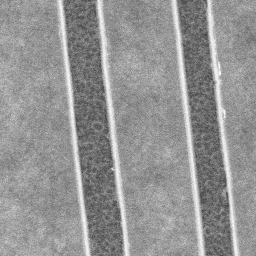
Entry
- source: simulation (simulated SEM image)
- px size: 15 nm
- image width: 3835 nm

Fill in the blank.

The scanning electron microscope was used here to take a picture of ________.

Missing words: one or a few lines or trenches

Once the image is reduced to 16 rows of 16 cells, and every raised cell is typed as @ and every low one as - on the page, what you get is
@@@@--@@@@@--@@@
@@@@--@@@@@--@@@
@@@@--@@@@@--@@@
@@@@---@@@@--@@@
@@@@---@@@@--@@@
@@@@---@@@@@--@@
@@@@---@@@@@--@@
@@@@@--@@@@@--@@
@@@@@--@@@@@--@@
@@@@@--@@@@@--@@
@@@@@--@@@@@--@@
@@@@@--@@@@@--@@
@@@@@---@@@@--@@
@@@@@---@@@@---@
@@@@@---@@@@---@
@@@@@---@@@@@--@